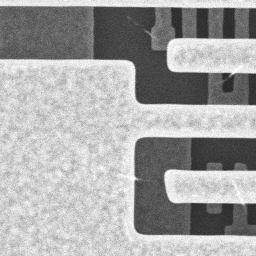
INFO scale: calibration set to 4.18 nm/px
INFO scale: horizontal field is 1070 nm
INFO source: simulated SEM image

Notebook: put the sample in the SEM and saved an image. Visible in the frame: wiring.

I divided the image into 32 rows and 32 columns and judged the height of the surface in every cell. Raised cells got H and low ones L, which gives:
HHHHHHHHHHHHHHHHHHHHHHHHHHHHHHHH
LLLLLLLLLLLLLLLLLLLLLLLLLLLLLLLL
LLLLLLLLLLLLLLLLLLLLLLLLLLLLLLLL
LLLLLLLLLLLLLLLLLLLLLLLLLLLLLLLL
LLLLLLLLLLLLLLLLLLLLLLLLLLLLLLLL
LLLLLLLLLLLLLLLLLLLLLHHHHHHHHHHH
LLLLLLLLLLLLLLLLLLLLLHHHHHHHHHHH
LLLLLLLLLLLLLLLLLLLLLHHHHHHHHHHH
HHHHHHHHHHHHHHHHHLLLLHHHHHHHHHHH
HHHHHHHHHHHHHHHHHLLLLLLLLLLLLLLL
HHHHHHHHHHHHHHHHHLLLLLLLLLLLLLLL
HHHHHHHHHHHHHHHHHLLLLLLLLLLLLLLL
HHHHHHHHHHHHHHHHHLLLLLLLLLLLLLLL
HHHHHHHHHHHHHHHHHHHHHHHHHHHHHHHH
HHHHHHHHHHHHHHHHHHHHHHHHHHHHHHHH
HHHHHHHHHHHHHHHHHHHHHHHHHHHHHHHH
HHHHHHHHHHHHHHHHHHHHHHHHHHHHHHHH
HHHHHHHHHHHHHHHHHLLLLLLLLLLLLLLL
HHHHHHHHHHHHHHHHHLLLLLLLLLLLLLLL
HHHHHHHHHHHHHHHHHLLLLLLLLLLLLLLL
HHHHHHHHHHHHHHHHHLLLLLLLLLLLLLLL
HHHHHHHHHHHHHHHHHLLLLHHHHHHHHHHH
HHHHHHHHHHHHHHHHHLLLLHHHHHHHHHHH
HHHHHHHHHHHHHHHHHLLLLHHHHHHHHHHH
HHHHHHHHHHHHHHHHHLLLLHHHHHHHHHHH
HHHHHHHHHHHHHHHHHLLLLLLLLLLLLLLL
HHHHHHHHHHHHHHHHHLLLLLLLLLLLLLLL
HHHHHHHHHHHHHHHHHLLLLLLLLLLLLLLL
HHHHHHHHHHHHHHHHHLLLLLLLLLLLLLLL
HHHHHHHHHHHHHHHHHHHHHHHHLLLLLLLL
HHHHHHHHHHHHHHHHHHHHHHHHHHHHHHHH
HHHHHHHHHHHHHHHHHHHHHHHHHHHHHHHH